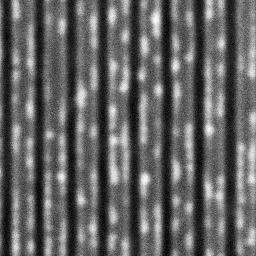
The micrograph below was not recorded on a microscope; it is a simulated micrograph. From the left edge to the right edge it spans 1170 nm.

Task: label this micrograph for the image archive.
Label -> parallel lines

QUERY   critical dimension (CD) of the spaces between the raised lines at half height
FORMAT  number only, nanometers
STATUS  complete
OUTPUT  61.8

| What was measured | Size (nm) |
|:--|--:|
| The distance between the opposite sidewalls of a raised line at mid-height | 85.8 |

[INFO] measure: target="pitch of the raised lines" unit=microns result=0.146